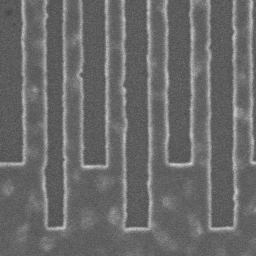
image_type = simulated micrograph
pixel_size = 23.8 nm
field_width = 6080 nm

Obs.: parallel lines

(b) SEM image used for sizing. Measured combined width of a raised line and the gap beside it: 989 nm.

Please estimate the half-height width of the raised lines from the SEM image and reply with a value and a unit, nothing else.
445 nanometres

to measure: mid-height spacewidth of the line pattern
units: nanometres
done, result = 564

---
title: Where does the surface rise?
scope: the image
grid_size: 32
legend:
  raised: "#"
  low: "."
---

...###..##...##...###...##...##.
...###..##...##...###...##...##.
...###..##...##...###...##...##.
...###..##...###..###...##...##.
...###..##...###...##...##...##.
...###..##...##....##...##...##.
...###..##...###...##...##...##.
...###..##...###..###...##...##.
...###..##...###...##...##...##.
...###..##...###...##...##...##.
...###..##...##....##...##...##.
...###..##...###...##...##...##.
...###..##...###...##...##...##.
...###..##...###...##...##...##.
...###..##...###...##...##...##.
...###..##...###...##...##...###
...###..##...###...##...##...###
...###..##...###...##...##...###
...###..##...###...##...##...###
...###..##...###...##...##...###
######..###..###...###.###...###
#####...########...#######...###
#####...########...#######...###
######..########...#######...###
######..########...#######...###
######..########...#######...###
######..########...#######...###
######..########...#######...###
######.##########.#########.####
################################
################################
################################